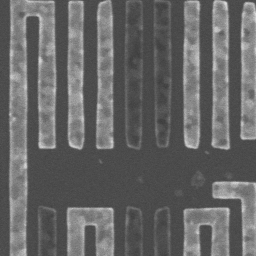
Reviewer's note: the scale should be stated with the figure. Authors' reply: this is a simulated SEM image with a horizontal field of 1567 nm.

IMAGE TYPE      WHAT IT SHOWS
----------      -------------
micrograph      wiring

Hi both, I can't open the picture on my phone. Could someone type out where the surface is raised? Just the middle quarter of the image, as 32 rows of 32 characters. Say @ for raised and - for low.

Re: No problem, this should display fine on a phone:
-@@@@----@@@---@@@@----@@@@---@@
-@@@@----@@@---@@@@----@@@@---@@
-@@@@----@@@---@@@@----@@@@---@@
-@@@-----@@@---@@@@----@@@@---@@
-@@@-----@@@---@@@@----@@@@---@@
-@@@-----@@@---@@@@----@@@@---@@
-@@@-----@@@---@@@@----@@@----@@
-@@@-----@@@---@@@@----@@@----@@
-@@@-----@@@---@@@@----@@@----@@
-@@@----@@@@---@@@@----@@@----@@
-@@@@---@@@@---@@@@----@@@----@@
-@@@@---@@@@---@@@@----@@@----@@
-@@@@---@@@@----@@@----@@@----@@
-@@@@---@@@@----@@@----@@@----@@
-@@@@---@@@@----@@@----@@@----@@
-@@@@---@@@@----@@@----@@@----@@
-@@@@---@@@@----@@@----@@@----@@
-@@@@---@@@@----@@@----@@@----@@
-@@@@---@@@@----@@@----@@@----@@
-@@@@---@@@@----@@@----@@@----@@
--@@----@@@@----@@@-----@@-----@
--------------------------------
--------------------------------
--------------------------------
--------------------------------
--------------------------------
--------------------------------
--------------------------------
--------------------------------
--------------------------------
--------------------------------
--------------------------------